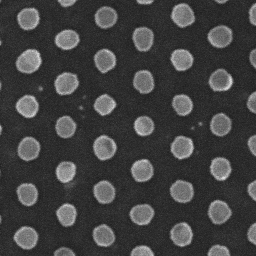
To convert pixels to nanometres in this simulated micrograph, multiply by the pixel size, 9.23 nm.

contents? a regular array of raised bodies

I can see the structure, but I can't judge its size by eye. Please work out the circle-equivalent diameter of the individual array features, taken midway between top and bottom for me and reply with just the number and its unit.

196 nanometres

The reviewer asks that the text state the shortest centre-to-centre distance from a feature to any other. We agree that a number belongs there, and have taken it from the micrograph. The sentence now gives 398 nm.